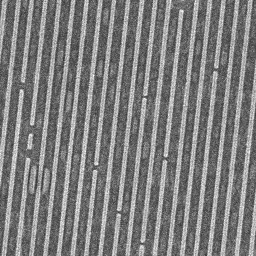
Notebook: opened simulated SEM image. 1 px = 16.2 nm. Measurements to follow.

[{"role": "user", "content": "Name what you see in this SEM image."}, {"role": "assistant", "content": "parallel lines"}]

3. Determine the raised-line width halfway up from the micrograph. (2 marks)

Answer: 42.3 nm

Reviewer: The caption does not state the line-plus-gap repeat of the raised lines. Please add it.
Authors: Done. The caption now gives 0.22 µm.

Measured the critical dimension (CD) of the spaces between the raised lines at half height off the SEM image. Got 171 nm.